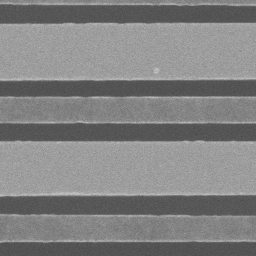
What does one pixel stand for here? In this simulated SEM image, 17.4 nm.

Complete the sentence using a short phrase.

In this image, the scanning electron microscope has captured lines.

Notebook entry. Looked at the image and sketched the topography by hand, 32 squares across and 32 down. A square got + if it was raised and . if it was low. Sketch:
.+++++++++++++++++++++++++++++++
................................
................................
++++++++++++++++++++++++++++++++
++++++++++++++++++++++++++++++++
++++++++++++++++++++++++++++++++
++++++++++++++++++++++++++++++++
++++++++++++++++++++++++++++++++
++++++++++++++++++++++++++++++++
++++++++++++++++++++++++++++++++
................................
................................
++++++++++++++++++++++++++++++++
++++++++++++++++++++++++++++++++
++++++++++++++++++++++++++++++++
................................
................................
................................
++++++++++++++++++++++++++++++++
++++++++++++++++++++++++++++++++
++++++++++++++++++++++++++++++++
++++++++++++++++++++++++++++++++
++++++++++++++++++++++++++++++++
++++++++++++++++++++++++++++++++
+...............................
................................
................................
++++++++++++++++++++++++++++++++
++++++++++++++++++++++++++++++++
++++++++++++++++++++++++++++++++
................................
................................